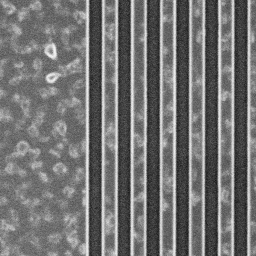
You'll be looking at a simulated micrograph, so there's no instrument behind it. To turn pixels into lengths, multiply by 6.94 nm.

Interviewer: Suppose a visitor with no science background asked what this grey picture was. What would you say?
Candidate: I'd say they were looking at parallel lines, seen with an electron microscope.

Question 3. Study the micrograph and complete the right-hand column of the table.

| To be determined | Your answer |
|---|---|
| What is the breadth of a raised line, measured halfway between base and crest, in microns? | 0.0971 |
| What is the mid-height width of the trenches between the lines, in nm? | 103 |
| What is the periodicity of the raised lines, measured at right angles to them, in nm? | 202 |